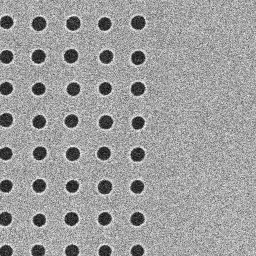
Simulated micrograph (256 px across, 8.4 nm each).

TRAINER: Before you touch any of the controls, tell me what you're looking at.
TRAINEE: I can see a regular array of holes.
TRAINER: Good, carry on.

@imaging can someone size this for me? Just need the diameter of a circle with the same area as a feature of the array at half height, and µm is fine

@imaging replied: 0.121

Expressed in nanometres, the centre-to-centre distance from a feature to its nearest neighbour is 269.